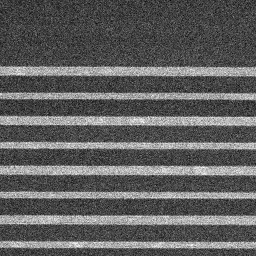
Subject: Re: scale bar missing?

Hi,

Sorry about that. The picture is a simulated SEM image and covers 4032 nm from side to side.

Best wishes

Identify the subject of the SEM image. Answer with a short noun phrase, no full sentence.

parallel lines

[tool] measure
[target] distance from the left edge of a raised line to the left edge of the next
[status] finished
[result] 390 nm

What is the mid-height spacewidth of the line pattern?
0.0925 µm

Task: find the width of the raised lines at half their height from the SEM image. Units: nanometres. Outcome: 301